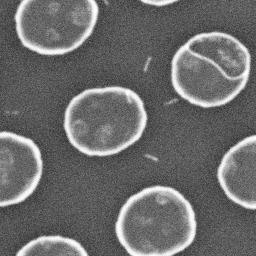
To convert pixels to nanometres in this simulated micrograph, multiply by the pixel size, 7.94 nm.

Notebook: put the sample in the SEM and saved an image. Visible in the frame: raised bodies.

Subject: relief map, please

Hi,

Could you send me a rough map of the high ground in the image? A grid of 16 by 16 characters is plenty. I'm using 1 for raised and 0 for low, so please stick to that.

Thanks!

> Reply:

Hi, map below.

0111110000000000
0111110000000000
0111100000001110
0000000000011110
0000000000011110
0000000000011110
0000111110001100
0000111110000000
1000111110000000
1100011000000011
1110000000000011
1100000000000011
1000000011100001
0000000011110000
0000000111110000
0011100011100000